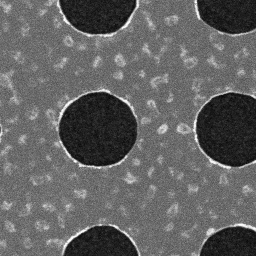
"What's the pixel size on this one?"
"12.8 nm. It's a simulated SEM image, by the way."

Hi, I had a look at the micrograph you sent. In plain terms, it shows holes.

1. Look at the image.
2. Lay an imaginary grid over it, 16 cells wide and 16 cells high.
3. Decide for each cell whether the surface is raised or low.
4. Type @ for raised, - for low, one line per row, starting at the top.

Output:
@@@@----@@@@----
@@@@----@@@@@---
@@@@@@@@@@@@@@@@
@@@@@@@@@@@@@@@@
@@@@@@@@@@@@@@@@
@@@@@@@@@@@@@@@@
@@@@----@@@@@---
@@@@-----@@@----
@@@@-----@@@----
@@@@----@@@@@---
@@@@@@@@@@@@@@@@
@@@@@@@@@@@@@@@@
@@@@@@@@@@@@@@@@
@@@@@@@@@@@@@@@@
@@@@@---@@@@@@--
@@@@----@@@@@---